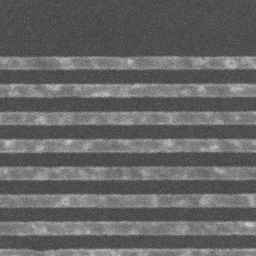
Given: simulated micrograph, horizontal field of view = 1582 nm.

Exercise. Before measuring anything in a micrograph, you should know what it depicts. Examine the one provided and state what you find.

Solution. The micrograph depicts parallel lines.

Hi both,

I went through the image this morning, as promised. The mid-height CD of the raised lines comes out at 73.4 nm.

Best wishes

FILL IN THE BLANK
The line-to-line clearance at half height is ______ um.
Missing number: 0.0966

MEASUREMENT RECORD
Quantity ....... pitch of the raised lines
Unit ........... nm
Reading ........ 170